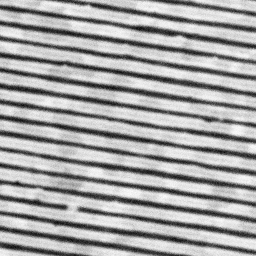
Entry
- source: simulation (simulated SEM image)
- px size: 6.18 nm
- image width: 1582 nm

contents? parallel lines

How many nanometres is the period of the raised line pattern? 96.8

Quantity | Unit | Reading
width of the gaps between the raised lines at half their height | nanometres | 50.4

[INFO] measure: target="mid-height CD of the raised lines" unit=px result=7.28